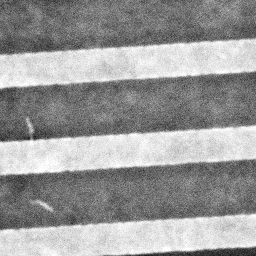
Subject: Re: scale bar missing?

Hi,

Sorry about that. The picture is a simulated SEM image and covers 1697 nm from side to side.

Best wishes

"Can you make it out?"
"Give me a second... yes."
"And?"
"lines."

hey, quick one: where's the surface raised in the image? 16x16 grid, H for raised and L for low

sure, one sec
LLLLLLLLLLLLLLLL
LLLLLLLLLLLLLLLL
LLLLLLLLLLLLLLLL
HHHHHHHHHHHHHHHH
HHHHHHHHHHHHHHHL
LLLLLLLLLLLLLLLL
LLLLLLLLLLLLLLLL
LLLLLLLLLLLLLLLL
LLLLLLLHHHHHHHHH
HHHHHHHHHHHHHHHH
HHHHHHLLLLLLLLLL
LLLLLLLLLLLLLLLL
LLLLLLLLLLLLLLLL
LLLLLLLLLLLLLLHH
HHHHHHHHHHHHHHHH
HHHHHHHHHHHHHHLL